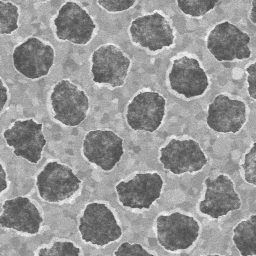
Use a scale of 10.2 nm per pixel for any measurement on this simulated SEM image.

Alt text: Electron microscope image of a regular array of holes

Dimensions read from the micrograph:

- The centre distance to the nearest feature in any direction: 546 nanometres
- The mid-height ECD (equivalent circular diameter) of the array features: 0.415 µm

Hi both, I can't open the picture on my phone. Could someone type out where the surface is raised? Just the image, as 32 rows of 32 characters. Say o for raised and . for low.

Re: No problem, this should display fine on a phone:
..oooooo..oo.....ooooo.....ooooo
..ooooo....oooooooo.ooo...ooooo.
..ooooo....oooooo....oooooooooo.
..ooooo.....oooo......ooooo...oo
ooooooo.....oooo......oooo.....o
oo....ooooooooooo....ooooo.....o
oo.....ooooo...ooooooooooo.....o
oo.....oooo.....oooooo...oo...oo
oo....ooooo.....ooooo....oooooo.
ooo..ooooooo....ooooo.....ooooo.
.oooooo..ooo...oooooo.....ooooo.
.ooooo....ooooooo..ooo....ooooo.
.ooooo.....oooooo....oooooo...oo
.ooooo.....ooooo.....ooooo.....o
ooooooo....ooooo....oooooo.....o
oo...ooo..oooooo....oooooo....oo
o....oooooo...ooooooooooooo...oo
o.....ooooo....oooooo...oooooooo
o....ooooo.....ooooo.....oooooo.
oo...ooooo.....ooooo......ooooo.
oooooo..oooo..oooooo......oooo..
.oooo....oooooooooooo...oooooo..
.oooo.....oooooo....oooooo...oo.
.oooo.....oooo......oooooo...ooo
ooooo....oooooo.....ooooo.....oo
....ooooooo..oo....oooooo.....oo
.....ooooo....oooooooo.oo....ooo
.....ooooo.....ooooo....ooooooo.
o....ooooo.....oooo......oooo...
oooooooooo.....ooooo.....oooo...
oooooo...oo..oo.oooo....ooooo...
ooooo.....oooo.....ooooooooooo..